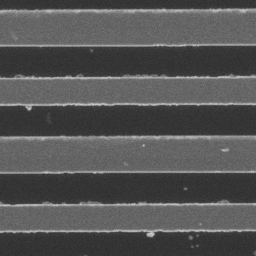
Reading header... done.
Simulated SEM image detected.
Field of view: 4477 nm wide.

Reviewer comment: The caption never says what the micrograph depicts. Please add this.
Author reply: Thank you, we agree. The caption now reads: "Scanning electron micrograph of lines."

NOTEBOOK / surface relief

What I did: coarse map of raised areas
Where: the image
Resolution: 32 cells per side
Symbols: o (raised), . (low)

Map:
................................
oooooooooooooooooooooooooooooooo
oooooooooooooooooooooooooooooooo
oooooooooooooooooooooooooooooooo
oooooooooooooooooooooooooooooooo
oooooooooooooooooooooooooooooooo
................................
................................
................................
................................
oooooooooooooooooooooooooooooooo
oooooooooooooooooooooooooooooooo
oooooooooooooooooooooooooooooooo
................................
................................
................................
................................
oooooooooooooooooooooooooooooooo
oooooooooooooooooooooooooooooooo
oooooooooooooooooooooooooooooooo
oooooooooooooooooooooooooooooooo
oooooooooooooooooooooooooooooooo
................................
................................
................................
.....o....oo..oooooooooooooooooo
oooooooooooooooooooooooooooooooo
oooooooooooooooooooooooooooooooo
oooooooooooooooooooooooooooooooo
................................
................................
................................